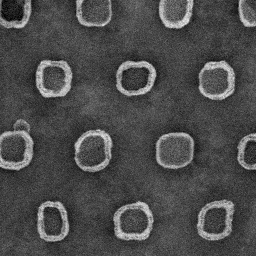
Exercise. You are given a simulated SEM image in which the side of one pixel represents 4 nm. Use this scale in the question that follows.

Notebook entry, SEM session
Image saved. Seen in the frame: a regular array of raised bodies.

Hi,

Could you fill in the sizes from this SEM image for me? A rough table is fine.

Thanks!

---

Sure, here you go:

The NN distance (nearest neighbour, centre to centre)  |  325 nanometres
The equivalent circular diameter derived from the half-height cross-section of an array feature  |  149 nanometers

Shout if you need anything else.